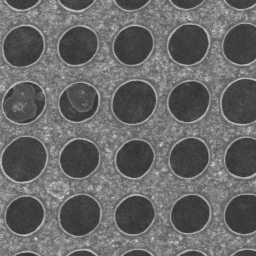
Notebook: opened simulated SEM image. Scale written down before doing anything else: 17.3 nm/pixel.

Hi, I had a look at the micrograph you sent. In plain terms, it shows a regular array of holes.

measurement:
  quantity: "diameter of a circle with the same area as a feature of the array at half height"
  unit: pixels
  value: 39.6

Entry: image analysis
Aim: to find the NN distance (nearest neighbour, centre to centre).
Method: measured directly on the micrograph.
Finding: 953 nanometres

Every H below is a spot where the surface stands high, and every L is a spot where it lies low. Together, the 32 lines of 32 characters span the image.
HLLLHHHHLLLHHHHLLLHHHHLLLHHHHLLL
HHHHHHHHHHHHHHHHHHHHHHHHHHHHHHHH
HHHHHHHHHHHHHHHHHHHHHHHHHHHHHHHH
HHLLHHHHHLLHHHHHLLHHHHLLLHHHHLLL
HLLLLHHHLLLLHHHLLLLHHLLLLLHHLLLL
LLLLLHHLLLLLHHLLLLLHHLLLLLHHLLLL
LLLLLHHLLLLLHHLLLLLHHLLLLLHHLLLL
HLLLLHHHLLLHHHHLLLHHHHLLLHHHHLLL
HHHHHHHHHHHHHHHHHHHHHHHHHHHHHHHH
HHHHHHHHHHHHHHHHHHHHHHHHHHHHHHHH
HHLLHHHHHLLHHHHHLLLHHHLLLHHHHLLL
HLLLLHHHLLLLHHLLLLLHHLLLLLHHLLLL
LLLLLLHLLLLLHHLLLLLLHLLLLLHHLLLL
LLLLLLHLLLLLHHLLLLLHHLLLLLHHLLLL
HLLLLHHHLLLHHHLLLLLHHHLLLHHHLLLL
HHHHHHHHHHHHHHHHLHHHHHHHHHHHHHHH
HHHHHHHHHHHHHHHHHHHHHHHHHHHHHHHH
HHLLLHHHHLLHHHHHHHHHHHHLLHHHHHLL
HLLLLLHHLLLLHHHLLLLHHHLLLLHHHLLL
LLLLLLHHLLLLHHHLLLLHHLLLLLHHLLLL
LLLLLLHHLLLLHHHLLLLHHLLLLLHHLLLL
HLLLLHHHLLLLHHHLLLHHHHLLLHHHHLLL
HHLLHHHHHHHHHHHHHHHHHHHHHHHHHHHH
HHHHHHHHHHHHHHHHHHHHHHHHHHHHHHHH
HHHHHHHHHLLHHHHHHLHHHHHLLHHHHHLL
HLLLLHHHLLLLHHHLLLLHHHLLLLHHHLLL
HLLLLLHLLLLLLHLLLLLHHLLLLLHHLLLL
HLLLLHHLLLLLHHLLLLLHHLLLLLHHLLLL
HLLLLHHHLLLLHHHLLLHHHHLLLHHHHLLL
HHHHHHHHHHHHHHHHHHHHHHHHHHHHHHHH
HHHHHHHHHHHHHHHHHHHHHHHHHHHHHHHH
HHHHHHHHHLLHHHHHLLHHHHHLLHHHHHLL